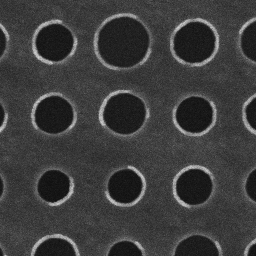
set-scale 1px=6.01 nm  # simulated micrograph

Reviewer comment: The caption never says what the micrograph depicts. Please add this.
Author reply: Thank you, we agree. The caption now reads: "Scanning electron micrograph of a regular array of holes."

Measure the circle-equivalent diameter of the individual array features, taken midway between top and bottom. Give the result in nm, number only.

220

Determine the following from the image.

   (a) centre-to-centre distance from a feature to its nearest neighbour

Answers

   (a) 422 nm